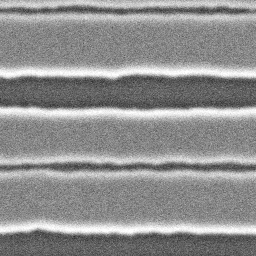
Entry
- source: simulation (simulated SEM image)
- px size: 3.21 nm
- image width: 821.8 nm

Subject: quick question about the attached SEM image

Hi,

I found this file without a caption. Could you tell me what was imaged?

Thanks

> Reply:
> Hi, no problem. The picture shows lines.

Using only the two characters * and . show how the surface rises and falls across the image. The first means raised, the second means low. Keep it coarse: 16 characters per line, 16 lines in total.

****************
****************
****************
****************
****************
................
................
****************
****************
****************
****************
****************
****************
****************
..............**
................